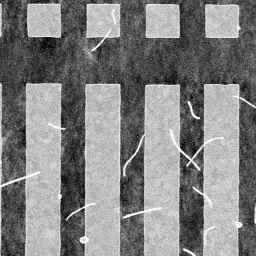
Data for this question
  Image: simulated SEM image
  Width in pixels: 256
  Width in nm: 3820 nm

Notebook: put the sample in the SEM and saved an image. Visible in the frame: groups of lines, slits or small figures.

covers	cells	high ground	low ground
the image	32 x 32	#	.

................................
...#####...####...####....####..
...#####...####...####....####..
...#####...####...####....####..
....###....####....###....###...
................................
................................
................................
................................
................................
................................
...#####...####...####....####..
...#####...####...####....####..
...#####...####...####....####..
...#####...####...####....####..
...#####...####...####....####..
...#####...####...####....####..
...#####...####...####....####..
...#####...####...#####..#####..
...#####...####...#####...####..
...#####...####...####....####..
...#####...####...####....####..
...#####...####...####....####..
...####....####...####....####..
...#####...####...####...#####..
...####....####...####....####..
...####....####...####....####..
...####....####...####....####..
...####....####...####....####..
...####...#####...####....####..
...#####..#####...####....####..
...####....####...####...#####..